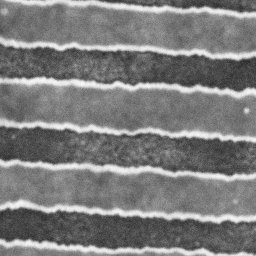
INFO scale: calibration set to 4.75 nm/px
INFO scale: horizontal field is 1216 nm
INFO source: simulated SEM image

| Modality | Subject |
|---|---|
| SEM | lines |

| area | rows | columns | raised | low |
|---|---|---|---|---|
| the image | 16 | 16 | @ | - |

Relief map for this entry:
@@@@@@@@@@@-----
@@@@@@@@@@@@@@@@
@@@@@@@@@@@@@@@@
-------------@@@
----------------
@@@@@@@@@@@@@---
@@@@@@@@@@@@@@@@
@@@@@@@@@@@@@@@@
-----------@@@@@
----------------
@@@@@@@@-@------
@@@@@@@@@@@@@@@@
@@@@@@@@@@@@@@@@
---------@@@@@@@
----------------
@@@@@@----------